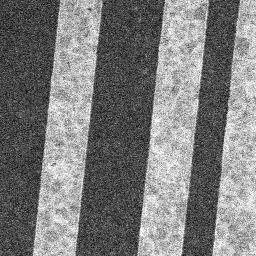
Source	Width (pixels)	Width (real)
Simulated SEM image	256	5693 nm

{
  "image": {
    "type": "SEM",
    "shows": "one or a few lines or trenches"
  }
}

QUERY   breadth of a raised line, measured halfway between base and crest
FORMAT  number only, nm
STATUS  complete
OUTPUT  910